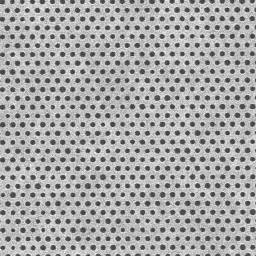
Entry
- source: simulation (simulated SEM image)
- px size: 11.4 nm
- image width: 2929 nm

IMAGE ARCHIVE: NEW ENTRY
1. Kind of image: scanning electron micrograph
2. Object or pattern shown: a regular array of holes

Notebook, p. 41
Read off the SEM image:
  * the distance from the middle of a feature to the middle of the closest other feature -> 9.55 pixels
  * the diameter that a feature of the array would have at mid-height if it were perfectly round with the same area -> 0.0591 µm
